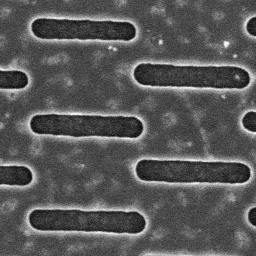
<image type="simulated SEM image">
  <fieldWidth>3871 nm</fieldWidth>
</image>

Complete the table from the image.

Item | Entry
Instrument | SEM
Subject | holes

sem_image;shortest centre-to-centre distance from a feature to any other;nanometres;1440